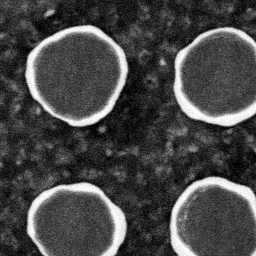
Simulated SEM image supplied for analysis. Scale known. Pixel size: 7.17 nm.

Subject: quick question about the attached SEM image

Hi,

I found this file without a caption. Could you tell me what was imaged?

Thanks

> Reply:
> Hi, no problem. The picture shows raised bodies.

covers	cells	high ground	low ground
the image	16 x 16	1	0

0000000000000000
0000000000000000
0001111000001111
0011111100011111
0011111100011111
0011111000011111
0001111000011111
0000110000000110
0000000000000000
0000000000000000
0000000000000000
0000000000001100
0011111000011111
0011111000011111
0011111000011111
0001111000011111